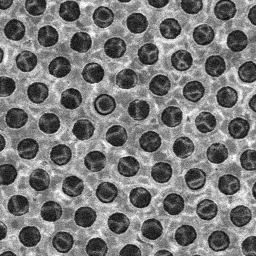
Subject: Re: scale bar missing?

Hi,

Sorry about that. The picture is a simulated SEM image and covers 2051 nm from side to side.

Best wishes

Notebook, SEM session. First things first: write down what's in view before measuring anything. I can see a regular array of holes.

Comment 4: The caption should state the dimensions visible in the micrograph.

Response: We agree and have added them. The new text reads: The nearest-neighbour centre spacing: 0.262 micrometres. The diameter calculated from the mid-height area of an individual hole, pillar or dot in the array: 0.176 um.